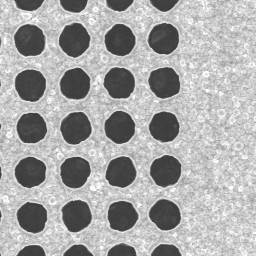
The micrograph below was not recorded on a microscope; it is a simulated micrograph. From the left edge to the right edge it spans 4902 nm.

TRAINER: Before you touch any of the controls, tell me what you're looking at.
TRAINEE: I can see a regular array of holes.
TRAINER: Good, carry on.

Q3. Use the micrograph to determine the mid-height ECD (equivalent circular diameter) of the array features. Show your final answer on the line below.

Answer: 0.598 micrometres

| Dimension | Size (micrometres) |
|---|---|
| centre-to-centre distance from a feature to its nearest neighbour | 0.838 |